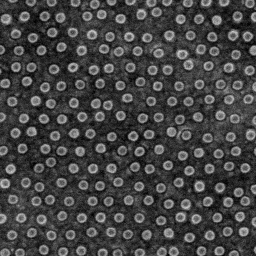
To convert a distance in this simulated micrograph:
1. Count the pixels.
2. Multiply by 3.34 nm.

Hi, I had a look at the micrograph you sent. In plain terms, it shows a regular array of raised bodies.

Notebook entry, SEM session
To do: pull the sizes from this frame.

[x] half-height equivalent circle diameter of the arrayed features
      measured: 30.8 nanometres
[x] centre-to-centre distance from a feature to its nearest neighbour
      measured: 50.7 nm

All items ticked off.